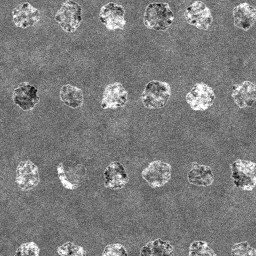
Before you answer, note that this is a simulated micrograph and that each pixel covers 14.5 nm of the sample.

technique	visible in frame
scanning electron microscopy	a regular array of holes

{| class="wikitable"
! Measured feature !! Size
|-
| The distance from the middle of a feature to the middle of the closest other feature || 613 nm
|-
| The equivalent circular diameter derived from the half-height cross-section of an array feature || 0.369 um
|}